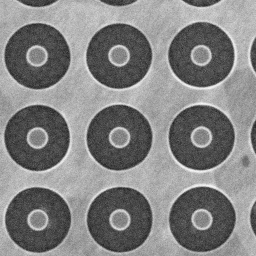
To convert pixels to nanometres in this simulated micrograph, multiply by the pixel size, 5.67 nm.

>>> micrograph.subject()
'an array of small figures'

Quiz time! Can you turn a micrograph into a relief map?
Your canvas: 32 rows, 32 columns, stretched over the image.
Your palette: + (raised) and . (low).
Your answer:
+++....++++++...+++++++....+++++
++++++++++++++++++++++++++++++++
++++++++++++++++++++++++++++++++
++.....++++++....++++++....+++++
+.......++++......++++.......+++
+.......+++........++........++.
+........++........++........++.
+........++........++........++.
+........++........++........+++
+.......++++......++++.......+++
++.....++++++....++++++....+++++
++++++++++++++++++++++++++++++++
++++++++++++++++++++++++++++++++
+++....++++++....++++++....+++++
++......++++......++++......++++
+.......+++........++........+++
+........++........++........++.
.........++........++........++.
+........++........++........+++
+.......+++.......++++.......+++
++.....+++++.....+++++......++++
++++++++++++++++++++++++++++++++
++++++++++++++++++++++++++++++++
++++..++++++++..++++++++...+++++
++......++++......++++......++++
+.......+++........+++.......+++
+........++........++........++.
+........++........++.........+.
+........++........++........++.
+.......+++........+++.......+++
++......++++......++++......++++
++++..++++++++..+++++++++.++++++